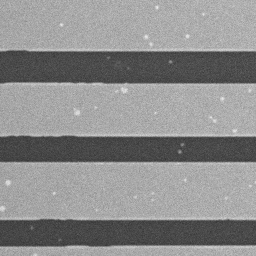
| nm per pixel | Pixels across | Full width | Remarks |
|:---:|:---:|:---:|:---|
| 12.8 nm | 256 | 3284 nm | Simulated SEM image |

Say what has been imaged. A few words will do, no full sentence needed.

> lines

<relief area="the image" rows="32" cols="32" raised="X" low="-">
XXXXXXXXXXXXXXXXXXXXXXXXXXXXXXXX
XXXXXXXXXXXXXXXXXXXXXXXXXXXXXXXX
XXXXXXXXXXXXXXXXXXXXXXXXXXXXXXXX
XXXXXXXXXXXXXXXXXXXXXXXXXXXXXXXX
XXXXXXXXXXXXXXXXXXXXXXXXXXXXXXXX
XXXXXXXXXXXXXXXXXXXXXXXXXXXXXXXX
--------------------------------
--------------------------------
--------------------------------
--------------------------------
XXXXXXXXXXXXX-------------------
XXXXXXXXXXXXXXXXXXXXXXXXXXXXXXXX
XXXXXXXXXXXXXXXXXXXXXXXXXXXXXXXX
XXXXXXXXXXXXXXXXXXXXXXXXXXXXXXXX
XXXXXXXXXXXXXXXXXXXXXXXXXXXXXXXX
XXXXXXXXXXXXXXXXXXXXXXXXXXXXXXXX
XXXXXXXXXXXXXXXXXXXXXXXXXXXXXXXX
--------------------------------
--------------------------------
--------------------------------
XXXXXXXXXXXXXXXXXXXXXXXXXXXXXXXX
XXXXXXXXXXXXXXXXXXXXXXXXXXXXXXXX
XXXXXXXXXXXXXXXXXXXXXXXXXXXXXXXX
XXXXXXXXXXXXXXXXXXXXXXXXXXXXXXXX
XXXXXXXXXXXXXXXXXXXXXXXXXXXXXXXX
XXXXXXXXXXXXXXXXXXXXXXXXXXXXXXXX
XXXXXXXXXXXXXXXXXXXXXXXXXXXXXXXX
--------------------------------
--------------------------------
--------------------------------
--------------------------------
XXXXXXXXXXXXXXXXXXXXXXXXXXXXXXXX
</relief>